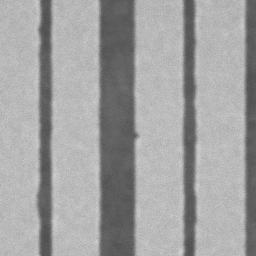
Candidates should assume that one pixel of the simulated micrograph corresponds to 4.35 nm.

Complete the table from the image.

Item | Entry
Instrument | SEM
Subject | one or a few lines or trenches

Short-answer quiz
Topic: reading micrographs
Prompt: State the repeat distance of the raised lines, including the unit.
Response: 315 nm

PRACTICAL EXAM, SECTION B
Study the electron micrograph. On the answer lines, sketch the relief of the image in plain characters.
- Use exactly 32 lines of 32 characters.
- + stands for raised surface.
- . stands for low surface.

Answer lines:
+++++..+++++.....++++++..+++++..
+++++..+++++.....++++++..+++++..
+++++..+++++.....++++++..+++++..
+++++..+++++.....++++++..+++++..
+++++..+++++.....++++++..+++++..
+++++..+++++.....++++++..+++++..
+++++..+++++.....++++++.++++++..
+++++..+++++.....++++++..++++++.
+++++..+++++.....++++++.++++++..
+++++..+++++.....++++++..+++++..
+++++..+++++.....++++++..+++++..
+++++..+++++.....++++++..+++++..
+++++..+++++.....++++++.++++++..
+++++..+++++.....++++++..+++++..
+++++..+++++.....++++++..+++++..
+++++..+++++.....++++++..+++++..
+++++..+++++.....++++++..+++++..
+++++..+++++.....++++++..+++++..
+++++..+++++.....++++++..+++++..
+++++..+++++.....++++++..+++++..
+++++..+++++.....++++++..+++++..
+++++..+++++.....++++++..+++++..
+++++..+++++.....++++++..++++++.
+++++..+++++.....++++++.++++++..
+++++..+++++.....++++++..+++++..
+++++..+++++.....++++++..+++++..
+++++..+++++.....++++++..+++++..
+++++..+++++.....++++++..+++++..
+++++..+++++.....++++++..+++++..
+++++..+++++.....++++++..++++++.
+++++..+++++.....++++++.+++++++.
+++++..+++++.....++++++.++++++..